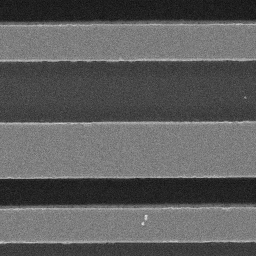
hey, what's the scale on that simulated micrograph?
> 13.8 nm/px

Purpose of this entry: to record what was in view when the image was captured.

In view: lines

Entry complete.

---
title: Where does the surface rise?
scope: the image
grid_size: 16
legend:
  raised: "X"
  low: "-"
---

----------------
----------------
XXXXXXXXXXXXXXXX
XXXXXXXXXXXXXXXX
----------------
----------------
----------------
----------------
XXXXXXXXXXXXXXXX
XXXXXXXXXXXXXXXX
XXXXXXXXXXXXXXXX
----------------
----------------
XXXXXXXXXXXXXXXX
XXXXXXXXXXXXXXXX
----------------